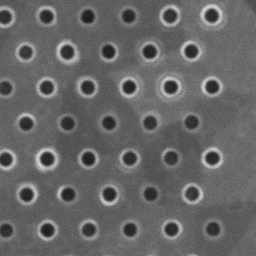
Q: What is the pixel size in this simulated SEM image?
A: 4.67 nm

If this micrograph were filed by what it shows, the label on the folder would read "a regular array of holes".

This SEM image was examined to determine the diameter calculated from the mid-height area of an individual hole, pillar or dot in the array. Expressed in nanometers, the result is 70.5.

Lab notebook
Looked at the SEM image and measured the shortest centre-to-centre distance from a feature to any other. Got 192 nm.